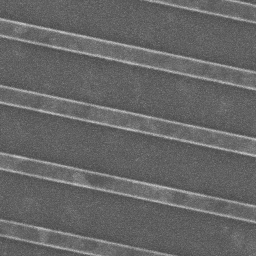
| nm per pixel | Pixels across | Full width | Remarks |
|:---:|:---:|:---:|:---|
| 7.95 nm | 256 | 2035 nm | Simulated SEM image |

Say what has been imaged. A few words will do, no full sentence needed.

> one or a few lines or trenches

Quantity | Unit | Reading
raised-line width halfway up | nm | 134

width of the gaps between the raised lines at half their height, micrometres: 0.39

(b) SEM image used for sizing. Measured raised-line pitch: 519 nm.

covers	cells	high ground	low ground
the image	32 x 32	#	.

.....................##########.
.........................#######
#.............................##
#####...........................
##########......................
.....##########.................
.........###########............
..............###########.......
...................##########...
........................########
.............................###
####............................
#########.......................
...##########...................
........##########..............
.............##########.........
.................###########....
......................##########
...........................#####
##..............................
#######.........................
..#########.....................
......##########................
............#########...........
.................#########......
.....................##########.
..........................######
..............................##
#####...........................
##########......................
.....##########.................
..........#########.............